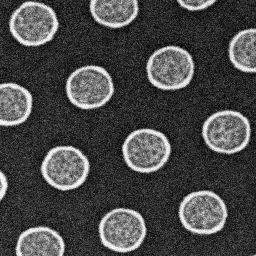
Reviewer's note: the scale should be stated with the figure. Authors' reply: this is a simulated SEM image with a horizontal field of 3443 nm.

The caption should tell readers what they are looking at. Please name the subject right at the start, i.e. a regular array of raised bodies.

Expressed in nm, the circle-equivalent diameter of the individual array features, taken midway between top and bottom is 565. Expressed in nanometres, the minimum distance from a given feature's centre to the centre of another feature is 1110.